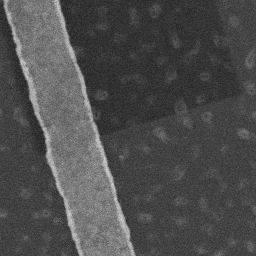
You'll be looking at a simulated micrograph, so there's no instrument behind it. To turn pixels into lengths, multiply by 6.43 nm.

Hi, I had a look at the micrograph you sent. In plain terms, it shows one or a few lines or trenches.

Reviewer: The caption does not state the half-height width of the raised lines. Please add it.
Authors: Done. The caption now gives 330 nm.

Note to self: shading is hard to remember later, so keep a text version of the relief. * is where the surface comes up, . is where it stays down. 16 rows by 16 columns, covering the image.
****............
.***............
.***............
.****...........
..***...........
..***...........
..****..........
...***..........
...***..........
...***..........
...****.........
....***.........
....***.........
....****........
.....***........
.....***........